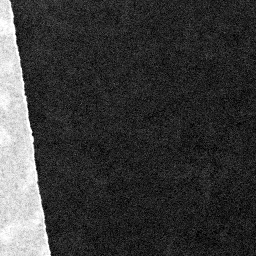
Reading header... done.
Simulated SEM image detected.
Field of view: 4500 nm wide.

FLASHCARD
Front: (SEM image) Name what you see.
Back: one or a few lines or trenches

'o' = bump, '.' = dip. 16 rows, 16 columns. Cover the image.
o...............
o...............
o...............
o...............
o...............
o...............
oo..............
oo..............
oo..............
oo..............
oo..............
oo..............
ooo.............
ooo.............
ooo.............
ooo.............